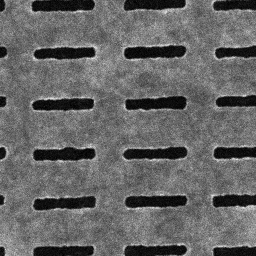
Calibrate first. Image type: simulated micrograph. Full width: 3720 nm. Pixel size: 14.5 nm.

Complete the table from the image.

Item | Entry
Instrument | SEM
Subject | a regular array of holes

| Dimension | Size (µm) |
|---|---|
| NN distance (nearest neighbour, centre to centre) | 0.716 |